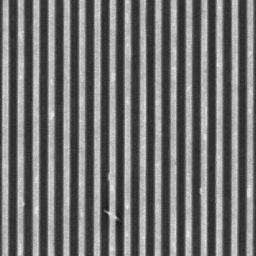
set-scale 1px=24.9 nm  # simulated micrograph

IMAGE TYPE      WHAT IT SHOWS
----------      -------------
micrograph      parallel lines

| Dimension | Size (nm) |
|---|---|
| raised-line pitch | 382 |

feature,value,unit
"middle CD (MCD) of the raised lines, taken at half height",0.15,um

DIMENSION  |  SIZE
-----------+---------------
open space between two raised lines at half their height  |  221 nanometres